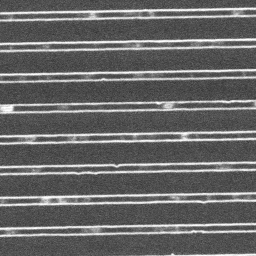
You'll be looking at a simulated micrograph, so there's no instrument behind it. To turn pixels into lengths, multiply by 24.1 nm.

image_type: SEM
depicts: parallel lines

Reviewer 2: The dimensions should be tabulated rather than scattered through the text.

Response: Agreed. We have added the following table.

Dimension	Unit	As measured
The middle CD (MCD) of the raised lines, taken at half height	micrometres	0.181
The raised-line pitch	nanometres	741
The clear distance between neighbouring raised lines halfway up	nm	560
